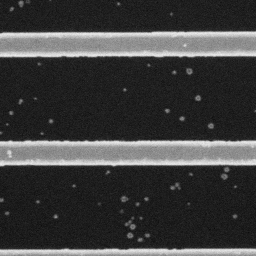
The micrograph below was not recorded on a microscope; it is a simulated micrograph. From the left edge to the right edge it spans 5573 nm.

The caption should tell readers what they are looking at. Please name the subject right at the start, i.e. lines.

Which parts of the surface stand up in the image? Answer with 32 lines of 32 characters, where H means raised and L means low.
LLLLLLLLLLLLLLLLLLLLLLLLLLLLLLLL
LLLLLLLLLLLLLLLLLLLLLLLLLLLLLLLL
LLLLLLLLLLLLLLLLLLLLLLLLLLLLLLLL
LLLLLLLLLLLLLLLLLLLLLLLLLLLLLLLL
HHHHHHHHHHHHHHHHHHHHHHHHHHHHHHHH
HHHHHHHHHHHHHHHHHHHHHHHHHHHHHHHH
HHHHHHHHHHHHHHHHHHHHHHHHHHHHHHHH
LLLLLLLLLLLLLLLLLLLLLLLLLLLLLLLL
LLLLLLLLLLLLLLLLLLLLLLLLLLLLLLLL
LLLLLLLLLLLLLLLLLLLLLLLLLLLLLLLL
LLLLLLLLLLLLLLLLLLLLLLLLLLLLLLLL
LLLLLLLLLLLLLLLLLLLLLLLLLLLLLLLL
LLLLLLLLLLLLLLLLLLLLLLLLLLLLLLLL
LLLLLLLLLLLLLLLLLLLLLLLLLLLLLLLL
LLLLLLLLLLLLLLLLLLLLLLLLLLLLLLLL
LLLLLLLLLLLLLLLLLLLLLLLLLLLLLLLL
LLLLLLLLLLLLLLLLLLLLLLLLLLLLLLLL
LLLLLLLLLLLLLLLLLLLLLLLLLLLLLLLL
HHHHHHHHHHHHHHHHHHHHHHHHHHHHHHHH
HHHHHHHHHHHHHHHHHHHHHHHHHHHHHHHH
HLLLLLLLLLLLLLHLLLLLLLLLLLLLLLLL
LLLLLLLLLLLLLLLLLLLLLLLLLLLLLLLL
LLLLLLLLLLLLLLLLLLLLLLLLLLLLLLLL
LLLLLLLLLLLLLLLLLLLLLLLLLLLLLLLL
LLLLLLLLLLLLLLLLLLLLLLLLLLLLLLLL
LLLLLLLLLLLLLLLLLLLLLLLLLLLLLLLL
LLLLLLLLLLLLLLLLLLLLLLLLLLLLLLLL
LLLLLLLLLLLLLLLLLLLLLLLLLLLLLLLL
LLLLLLLLLLLLLLLLLLLLLLLLLLLLLLLL
LLLLLLLLLLLLLLLLLLLLLLLLLLLLLLLL
LLLLLLLLLLLLLLLLLLLLLLLLLLLLLLLL
HHHHHHHHHHHHHHHHHHHHHHHHHHHHHHHH